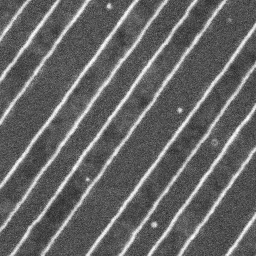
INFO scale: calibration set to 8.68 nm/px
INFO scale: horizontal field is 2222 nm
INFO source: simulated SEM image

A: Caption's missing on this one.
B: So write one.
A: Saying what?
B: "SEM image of lines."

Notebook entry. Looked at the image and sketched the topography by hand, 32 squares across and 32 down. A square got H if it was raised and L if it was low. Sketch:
HHHLLLLHHHHLLLLLLHHHHLLLHHHHLLLL
HHLLLLHHHHLLLLLLHHHHLLLHHHHLLLLL
HHLLLHHHHLLLLLLHHHHLLLLHHHLLLLLL
HLLLLHHHHLLLLLHHHHLLLLHHHHLLLLLL
LLLLHHHHLLLLLLHHHHLLLHHHHLLLLLLH
LLLHHHHLLLLLLHHHHLLLLHHHLLLLLLHH
LLHHHHLLLLLLHHHHLLLLHHHHLLLLLHHH
LLHHHHLLLLLLHHHLLLLHHHHLLLLLLHHH
LHHHHLLLLLLHHHHLLLHHHHLLLLLLHHHH
HHHHLLLLLLHHHHLLLHHHHLLLLLLHHHHL
HHHHLLLLLHHHHLLLLHHHHLLLLLLHHHLL
HHHLLLLLLHHHHLLLHHHHLLLLLLHHHHLL
HHLLLLLLHHHHLLLHHHHLLLLLLHHHHLLL
HLLLLLLHHHHLLLLHHHHLLLLLHHHHLLLL
HLLLLLHHHHLLLLHHHHLLLLLLHHHHLLLH
LLLLLLHHHHLLLHHHHLLLLLLHHHHLLLHH
LLLLLHHHHLLLLHHHLLLLLLHHHHLLLHHH
LLLLHHHHLLLLHHHHLLLLLHHHHLLLLHHH
LLLLHHHHLLLHHHHLLLLLLHHHHLLLHHHH
LLLHHHHLLLHHHHLLLLLLHHHHLLLHHHHL
LLHHHHLLLLHHHHLLLLLHHHHLLLLHHHHL
LHHHHLLLLHHHHLLLLLHHHHHLLLHHHHLL
LHHHHLLLHHHHLLLLLLHHHHLLLHHHHLLL
HHHHLLLLHHHLLLLLLHHHHLLLLHHHHLLL
HHHLLLLHHHHLLLLLHHHHLLLLHHHHLLLL
HHHLLLHHHHLLLLLHHHHHLLLHHHHLLLLL
HHLLLHHHHLLLLLLHHHHLLLHHHHLLLLLL
HLLLLHHHHLLLLLHHHHLLLLHHHHLLLLLH
LLLLHHHHLLLLLHHHHLLLLHHHHLLLLLLH
LLLHHHHLLLLLLHHHHLLLHHHHLLLLLLHH
LLHHHHLLLLLLHHHHLLLLHHHHLLLLLHHH
LLHHHHLLLLLHHHHLLLLHHHHLLLLLLHHH